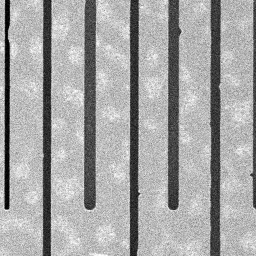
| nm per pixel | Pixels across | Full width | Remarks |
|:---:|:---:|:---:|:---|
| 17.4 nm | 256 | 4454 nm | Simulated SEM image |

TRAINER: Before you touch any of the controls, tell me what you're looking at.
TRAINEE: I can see parallel lines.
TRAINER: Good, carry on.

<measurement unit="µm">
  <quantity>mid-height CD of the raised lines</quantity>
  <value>0.572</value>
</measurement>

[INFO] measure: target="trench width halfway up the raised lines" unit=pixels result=8.75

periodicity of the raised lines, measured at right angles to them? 42.1 px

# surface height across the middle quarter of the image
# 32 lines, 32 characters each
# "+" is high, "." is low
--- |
+++++...++++++++...+++++++...+++
+++++...++++++++...+++++++...+++
+++++...++++++++...+++++++...+++
+++++...++++++++...+++++++...+++
+++++...++++++++...+++++++...+++
+++++...++++++++...+++++++...+++
+++++...++++++++...+++++++...+++
+++++...++++++++...+++++++...+++
+++++...++++++++...+++++++...+++
+++++...++++++++...+++++++...+++
+++++...++++++++...+++++++...+++
+++++...++++++++...+++++++...+++
+++++...++++++++...+++++++...+++
+++++...++++++++...+++++++...+++
+++++...++++++++...+++++++...+++
+++++...++++++++...+++++++...+++
+++++...++++++++...+++++++...+++
+++++...++++++++...+++++++...+++
+++++...++++++++...+++++++...+++
+++++...++++++++...+++++++...+++
+++++...++++++++...+++++++...+++
+++++...++++++++...+++++++...+++
+++++...++++++++...+++++++...+++
+++++...++++++++...+++++++...+++
+++++...++++++++...+++++++...+++
+++++...++++++++...+++++++...+++
+++++...++++++++...+++++++...+++
+++++...++++++++...+++++++...+++
+++++...++++++++...+++++++...+++
+++++...++++++++...+++++++...+++
+++++...++++++++...+++++++...+++
+++++...++++++++...+++++++...+++